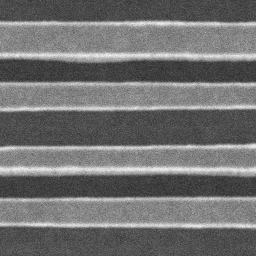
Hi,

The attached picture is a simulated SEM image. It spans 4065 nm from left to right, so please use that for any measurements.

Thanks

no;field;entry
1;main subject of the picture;lines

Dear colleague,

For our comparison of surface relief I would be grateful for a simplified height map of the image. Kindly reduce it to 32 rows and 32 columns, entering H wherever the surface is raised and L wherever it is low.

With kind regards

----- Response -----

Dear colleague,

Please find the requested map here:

LLLLLLLLLLLLLLLLLLLLLLLLLLLLLLLL
LLLLLLLLLLLLLLLLLLLLLLLLLLLLLLLL
LLLLLLLLLLLLLLLLLLLLLLLLLLLLLLLL
HHHHHHHHHHHHHHHHHHHHHHHHHHHHHHHH
HHHHHHHHHHHHHHHHHHHHHHHHHHHHHHHH
HHHHHHHHHHHHHHHHHHHHHHHHHHHHHHHH
HHHHHHHHHHHHHHHHHHHHHHHHHHHHHHHH
LLLLLLLLLLLLLLLLLLLLLLLLLLLLLLLL
LLLLLLLLLLLLLLLLLLLLLLLLLLLLLLLL
LLLLLLLLLLLLLLLLLLLLLLLLLLLLLLLL
HHHHHHHHHHHHHHHHHHHHHHHLHHLLHHHH
HHHHHHHHHHHHHHHHHHHHHHHHHHHHHHHH
HHHHHHHHHHHHHHHHHHHHHHHHHHHHHHHH
HHHHHHHHHHHHHHHHHHHHLLLLLLLLLLLL
LLLLLLLLLLLLLLLLLLLLLLLLLLLLLLLL
LLLLLLLLLLLLLLLLLLLLLLLLLLLLLLLL
LLLLLLLLLLLLLLLLLLLLLLLLLLLLLLLL
LLLLLLLLLLLLLLLLLLLLLLLLLLLLLLLL
HHHHHHHHHHHHHHHHHHHHHHHHHHHHHHHH
HHHHHHHHHHHHHHHHHHHHHHHHHHHHHHHH
HHHHHHHHHHHHHHHHHHHHHHHHHHHHHHHH
LLLLLLLLLLLLLLLLLLLLLLLLLLLLLHHH
LLLLLLLLLLLLLLLLLLLLLLLLLLLLLLLL
LLLLLLLLLLLLLLLLLLLLLLLLLLLLLLLL
LLLLLLLLLLLLLLLLLLLLLLLLLLLLLLLL
HHHHHHHHHHHHHHHHHHHHHHHHHHHHHHHH
HHHHHHHHHHHHHHHHHHHHHHHHHHHHHHHH
HHHHHHHHHHHHHHHHHHHHHHHHHHHHHHHH
LLLLLLLLLLLLLLLLLLLLLLLLLLLLLLLL
LLLLLLLLLLLLLLLLLLLLLLLLLLLLLLLL
LLLLLLLLLLLLLLLLLLLLLLLLLLLLLLLL
LLLLLLLLLLLLLLLLLLLLLLLLLLLLLLLL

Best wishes